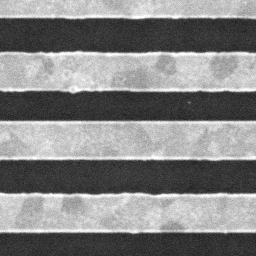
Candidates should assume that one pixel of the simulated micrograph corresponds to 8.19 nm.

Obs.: lines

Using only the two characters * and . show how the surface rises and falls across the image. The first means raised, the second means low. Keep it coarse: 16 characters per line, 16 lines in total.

****************
................
................
****************
****************
****************
................
................
****************
****************
................
................
****************
****************
........*.......
................